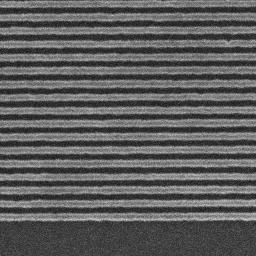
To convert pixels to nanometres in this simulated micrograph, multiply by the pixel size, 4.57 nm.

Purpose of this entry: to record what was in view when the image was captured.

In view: parallel lines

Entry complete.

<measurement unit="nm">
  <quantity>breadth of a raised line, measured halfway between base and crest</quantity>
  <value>26.3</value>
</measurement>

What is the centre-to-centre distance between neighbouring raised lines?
13.3 pixels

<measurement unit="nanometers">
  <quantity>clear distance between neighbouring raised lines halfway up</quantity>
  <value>34.8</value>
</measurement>